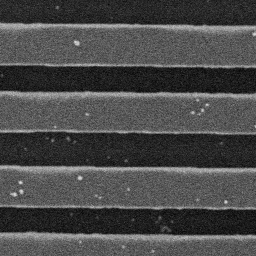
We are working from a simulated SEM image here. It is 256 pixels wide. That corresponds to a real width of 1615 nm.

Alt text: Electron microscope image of lines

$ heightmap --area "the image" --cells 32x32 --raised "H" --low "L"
LLLLLLLLLLLLLLLLLLLLLLLLLLLLLLLL
LLLLLLLLLLLLLLLLLLLLLLLLLLLLLLLL
LLLLLLLLLLLLLLLLLLLLLLLLLLLLLLLL
HHHHHHHHHHHHHHHHHHHHHHHHHHHHHHHH
HHHHHHHHHHHHHHHHHHHHHHHHHHHHHHHH
HHHHHHHHHHHHHHHHHHHHHHHHHHHHHHHH
HHHHHHHHHHHHHHHHHHHHHHHHHHHHHHHH
HHHHHHHHHHHHHHHHHHHHHHHHHHHHHHHH
LLLLLLLLLLLLLLLLLLLLLLLLLLLLLLLL
LLLLLLLLLLLLLLLLLLLLLLLLLLLLLLLL
LLLLLLLLLLLLLLLLLLLLLLLLLLLLLLLL
HHLLLLLLLLLLLLLLLLLLLLLLLLLLLLLL
HHHHHHHHHHHHHHHHHHHHHHHHHHHHHHHH
HHHHHHHHHHHHHHHHHHHHHHHHHHHHHHHH
HHHHHHHHHHHHHHHHHHHHHHHHHHHHHHHH
HHHHHHHHHHHHHHHHHHHHHHHHHHHHHHHH
LLLLLLLLLLLLLLHHLHHHHHHHHHHHHHHH
LLLLLLLLLLLLLLLLLLLLLLLLLLLLLLLL
LLLLLLLLLLLLLLLLLLLLLLLLLLLLLLLL
LLLLLLLLLLLLLLLLLLLLLLLLLLLLLLLL
LLLLLLLLLLLLLLLLLLLLLLLLLLLLLLLL
HHHHHHHHHHHHHHHHHHHHHHHHHHHHHHHH
HHHHHHHHHHHHHHHHHHHHHHHHHHHHHHHH
HHHHHHHHHHHHHHHHHHHHHHHHHHHHHHHH
HHHHHHHHHHHHHHHHHHHHHHHHHHHHHHHH
HHHHHHHHHHHHHHHHHHHHHHHHHHHHHHHH
LLLLLLLLLLLLLLLLLLLLLLLLLLLLLLLL
LLLLLLLLLLLLLLLLLLLLLLLLLLLLLLLL
LLLLLLLLLLLLLLLLLLLLLLLLLLLLLLLL
HHHHHHHHHHHHHHHHHHHHHHHHHHHHHHHH
HHHHHHHHHHHHHHHHHHHHHHHHHHHHHHHH
HHHHHHHHHHHHHHHHHHHHHHHHHHHHHHHH